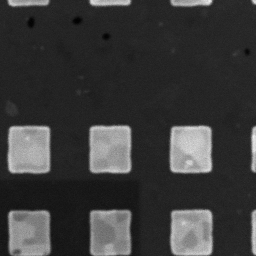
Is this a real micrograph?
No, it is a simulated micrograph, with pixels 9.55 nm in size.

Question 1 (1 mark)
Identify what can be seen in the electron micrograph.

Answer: wiring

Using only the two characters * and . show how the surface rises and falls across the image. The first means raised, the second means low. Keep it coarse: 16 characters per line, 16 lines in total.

................
................
................
................
................
................
................
................
.**...**...**...
.**...**...**...
.**...**...**...
................
................
.**...**...**...
.**...**...**...
.**...**...**...